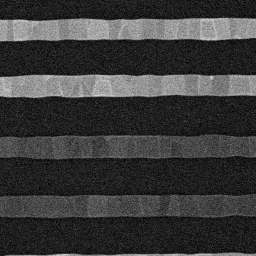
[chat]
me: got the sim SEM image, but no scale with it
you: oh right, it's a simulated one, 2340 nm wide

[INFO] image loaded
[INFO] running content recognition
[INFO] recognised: groups of lines, slits or small figures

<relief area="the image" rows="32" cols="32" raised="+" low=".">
................................
................................
........+++++.++.+++..++++++++++
++++++++++++++++++++++++++++++++
++++++++++++++++++++++++++++++++
................................
................................
................................
................................
...........+..++..+..+++++..++++
++++++++++++++++++++++++++++++++
++++++++++++++++++++++++++++++++
................................
................................
................................
................................
................................
++++++++++++++++++++++++++++++++
+++++++++++++++++++++..+++++++++
+++++++++++++++++++++..++++++.++
................................
................................
................................
................................
.........++++...+++.+++++++++.++
++++++++++++++++++++++++++++++++
++++++++++++++++++++++++++++++++
................................
................................
................................
................................
................................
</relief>